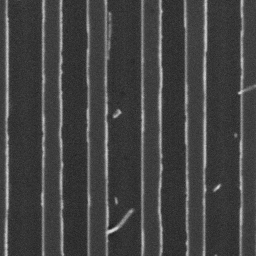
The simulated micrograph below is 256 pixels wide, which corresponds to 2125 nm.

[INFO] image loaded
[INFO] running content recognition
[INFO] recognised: lines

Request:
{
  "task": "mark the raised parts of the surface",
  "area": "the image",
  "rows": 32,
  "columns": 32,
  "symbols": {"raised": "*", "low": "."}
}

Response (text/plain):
*....***...**.....**...***....**
*....***...**.....**...***....**
*....***...**.....**...***....**
*....***...**.....**...***....**
*....***...**.....**...***....**
*....***...**.....**...***....**
*....***...**.....**...***....**
*....***...**.....**...***....**
*....***...**.....**...***....**
*....***...**.....**...***....**
*....***...**.....**...***....**
*....***...**.....**...***....**
*....***...**.....**...***....**
*....***...**.....**...***....**
*....***...**.....**...***....**
*....***...**.....**...***....**
*....***...**.....**...***....**
*....***...**.....**...***....**
*....***...**.....**...***....**
*....***...**.....**...***....**
*....***...**.....**...***....**
*....***...**.....**...***....**
*....***...**.....**...***....**
*....***...**.....**...***....**
*....***...**.....**...***....**
*....***...**.....**...***....**
*....***...**.....**...***....**
*....***...**.....**...***....**
*....***...***....**...***....**
*....***...**.....**...***....**
*....***...**.....**...***....**
*....***...**.....**...***....**